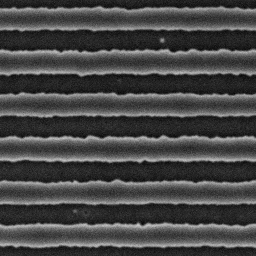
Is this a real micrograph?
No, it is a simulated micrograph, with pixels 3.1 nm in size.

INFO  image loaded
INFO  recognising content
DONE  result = lines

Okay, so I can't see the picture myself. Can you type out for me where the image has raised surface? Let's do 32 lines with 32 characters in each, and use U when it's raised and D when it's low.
DDDDDDDDDDDDDDDDDDDDDDDDDDDDDDDD
UUUUUUUUUUUUUUUUUUUUUUUUUUUUUUUU
UUUUUUUUUUUUUUUUUUUUUUUUUUUUUUUU
UUUUUUUUUUUUUUUUUUUUUUUUUUUUUUUU
DDDDDDDDDDDDDDDDDDDDDDDDDDDDDDDD
DDDDDDDDDDDDDDDDDDDDDDDDDDDDDDDD
UUUUUUUUUUDDUUUUUUUUUUUUUUUUUUUU
UUUUUUUUUUUUUUUUUUUUUUUUUUUUUUUU
UUUUUUUUUUUUUUUUUUUUUUUUUUUUUUUU
DDDDDDDDDDDDDDDDDDDDDDDDDDDDDDDD
DDDDDDDDDDDDDDDDDDDDDDDDDDDDDDDD
DDDDDDDDDDDDDDDDDDDDDDDDDDDDDDDD
UUUUUUUUUUUUUUUUUUUUUUUUUUUUUUUU
UUUUUUUUUUUUUUUUUUUUUUUUUUUUUUUU
DDDDUUDDDDDDDDDDDDDDDDUDDDDDDDDD
DDDDDDDDDDDDDDDDDDDDDDDDDDDDDDDD
DDDDDDDDDDDDDDDDDDDDDDDDDDDDDDDD
UUUUUUUUUUUUUUUUUUUUUUUUUUUUUUUU
UUUUUUUUUUUUUUUUUUUUUUUUUUUUUUUU
UUUUUUUUUUUUUUUUUUUUUUUUUUUUUUUU
DDDDDDDDDDDDDDDDDDDDDDDDDDDDDDDD
DDDDDDDDDDDDDDDDDDDDDDDDDDDDDDDD
DDDDDDDDDDDDDDDDDDDDDDDDDDDDDDDD
UUUUUUUUUUUUUUUUUUUUUUUUUUUUUUUU
UUUUUUUUUUUUUUUUUUUUUUUUUUUUUUUU
DDDUDDDDDDDUDDDDDDDDDDDDDDDUDDDD
DDDDDDDDDDDDDDDDDDDDDDDDDDDDDDDD
DDDDDDDDDDDDDDDDDDDDDDDDDDDDDDDD
UUUUUUUUUUUUUUUUUUUUUUUUUUUUUUUU
UUUUUUUUUUUUUUUUUUUUUUUUUUUUUUUU
UUUUUUUUUUUUUUUUUUUUUUUUUUUUUUUU
DDDDDDDDDDDDDDDDDDDDDDDDDDDDDDDD